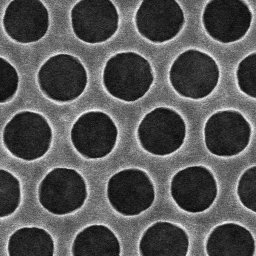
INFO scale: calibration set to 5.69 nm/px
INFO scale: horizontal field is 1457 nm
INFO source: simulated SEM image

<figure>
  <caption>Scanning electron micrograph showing a regular array of holes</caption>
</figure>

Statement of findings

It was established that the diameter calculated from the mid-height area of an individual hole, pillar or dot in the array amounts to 269 nanometres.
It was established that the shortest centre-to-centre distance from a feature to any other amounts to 369 nm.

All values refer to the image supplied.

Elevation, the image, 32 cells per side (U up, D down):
UDDDDUUUUDDDDDUUUUDDDDUUUUDDDDDU
UDDDDDUUUDDDDDDUUDDDDDDUUDDDDDDU
DDDDDDUUUDDDDDDUUDDDDDDUUDDDDDDU
UDDDDDUUUDDDDDDUUDDDDDDUUUDDDDDU
UDDDDUUUUDDDDDUUUUDDDDUUUUDDDDUU
UUUUUUUUUUUUUUUUUUUUUUUUUUUUUUUU
UUUUUUUUUUUUUUUUUUUUUUUDDUUUUUUU
DUUUUUDDDDUUUUDDDDUUUUDDDDDUUUDD
DDUUUDDDDDDUUDDDDDDUUDDDDDDUUUDD
DDUUUDDDDDDUUDDDDDDUUDDDDDDUUUDD
DDUUUDDDDDDUUDDDDDDUUDDDDDDUUUDD
DDUUUDDDDDUUUUDDDDUUUUDDDDUUUUDD
DUUUUUUDDUUUUUUDDUUUUUUUUUUUUUUU
UUUUUUUUUUUUUUUUUUUUDUUUUUUUUUUU
UUDDDUUUUUDDDDUUUUDDDDUUUUDDDDUU
UDDDDDUUUDDDDDUUUUDDDDDUUUDDDDDU
DDDDDDUUUDDDDDDUUDDDDDDUUUDDDDDU
DDDDDDUUUDDDDDDUUUDDDDDUUUDDDDDU
UDDDDDUUUDDDDDUUUUDDDDUUUUDDDDDU
UUDDDUUUUUDDDUUUUUUUUUUUUUUUDUUU
UUUUUUUUUUUUUUUUUUUUUUUUUUUUUUUU
DUUUUUDDDDUUUUUDDDUUUUDDDDUUUUUD
DDUUUDDDDDUUUUDDDDDUUDDDDDDUUUDD
DDDUUDDDDDDUUDDDDDDUUDDDDDDUUUDD
DDUUUDDDDDDUUDDDDDDUUUDDDDDUUUDD
DDUUUDDDDDUUUUDDDDDUUUDDDDDUUUDD
DDUUUUDDDUUUUUUDDDUUUUUUDUUUUUUU
UUUUUUUUUUUUUUUUUUUUUUUUUUUUUUUU
UUUDDUUUUUUDDUUUUUUDDDUUUUUDDDUU
UDDDDDUUUUDDDDUUUUDDDDDUUUDDDDDU
UDDDDDDUUDDDDDDUUDDDDDDDUUDDDDDD
UDDDDDDUUDDDDDDUUDDDDDDUUUDDDDDD